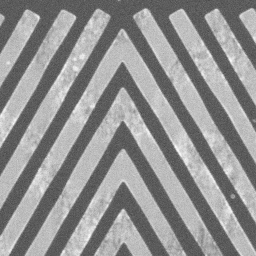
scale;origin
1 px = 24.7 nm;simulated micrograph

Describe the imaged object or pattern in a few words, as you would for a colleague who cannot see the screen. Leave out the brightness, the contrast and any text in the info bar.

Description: groups of lines, slits or small figures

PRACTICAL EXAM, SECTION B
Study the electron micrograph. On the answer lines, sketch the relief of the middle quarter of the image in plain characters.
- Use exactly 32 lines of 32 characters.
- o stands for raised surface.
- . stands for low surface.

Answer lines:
ooooo....ooooo..oooo.....oooo...
oooo....ooooo...ooooo....ooooo..
ooo.....oooo.....ooooo....ooooo.
ooo....ooooo.....ooooo....ooooo.
oo.....oooo.......ooooo....ooooo
o.....ooooo........oooo.....oooo
o.....oooo....o....ooooo....oooo
.....oooo.....oo....ooooo....ooo
....ooooo....oooo...ooooo....ooo
....oooo.....oooo....ooooo....oo
...ooooo....oooooo....oooo....oo
..ooooo....ooooooo....ooooo....o
..oooo.....oooooooo....ooooo....
.ooooo....ooooooooo.....oooo....
.oooo.....oooo.ooooo....ooooo...
ooooo....ooooo..oooo.....oooo...
oooo....ooooo....oooo....ooooo..
oooo....oooo.....oooo.....ooooo.
ooo....ooooo......oooo....ooooo.
ooo....oooo.......ooooo....ooooo
oo....ooooo........oooo.....oooo
o....ooooo.........ooooo....oooo
o....ooooo....oo....ooooo....ooo
....ooooo....ooo.....oooo....ooo
....ooooo....oooo....ooooo....oo
...ooooo....oooooo....oooo.....o
...oooo....ooooooo....ooooo....o
..ooooo....oooooooo....oooo.....
.ooooo....ooooooooo.....oooo....
.ooooo....oooo.ooooo....ooooo...
ooooo....ooooo..oooo.....oooo...
oooo.....oooo....oooo....ooooo..